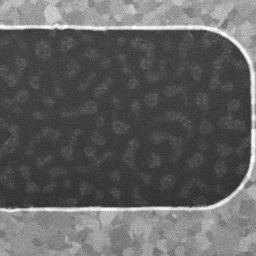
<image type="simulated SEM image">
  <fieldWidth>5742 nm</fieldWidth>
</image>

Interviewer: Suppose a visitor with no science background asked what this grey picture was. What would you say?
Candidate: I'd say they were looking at one or a few lines or trenches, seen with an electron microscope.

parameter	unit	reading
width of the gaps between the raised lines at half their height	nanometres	4060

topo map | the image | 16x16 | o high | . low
oooooooooooooooo
oooooooooooooooo
...............o
...............o
................
................
................
................
................
................
................
...............o
..............oo
oooooooooooooooo
oooooooooooooooo
oooooooooooooooo